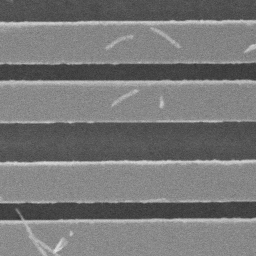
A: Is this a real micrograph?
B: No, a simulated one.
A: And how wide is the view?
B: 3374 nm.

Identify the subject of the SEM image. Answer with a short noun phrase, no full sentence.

lines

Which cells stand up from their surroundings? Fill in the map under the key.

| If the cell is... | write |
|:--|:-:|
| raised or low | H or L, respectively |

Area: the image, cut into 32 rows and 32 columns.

LLLLLLLLLLLLLLLLLLLLLLLLLLLLLLLL
LLLLLLLLLLLLLLLLLLLLLLLLLLLLLLLL
LLLLLLLLLLLLLLLLLLLLLLLLLLLLLLLL
HHHHHHHHHHHHHHHHHHHHHHHHHHHHHHHH
HHHHHHHHHHHHHHHHHHHHHHHHHHHHHHHH
HHHHHHHHHHHHHHHHHHHHHHHHHHHHHHHH
HHHHHHHHHHHHHHHHHHHHHHHHHHHHHHHH
HHHHHHHHHHHHHHHHHHHHHHHHHHHHHHHH
LLLLLLLLLLLLLLLLLLLLLLLLLLLLLLLL
LLLLLLLLLLLLLLLLLLLLLLLLLLLLLLLL
HHHHHHHHHHHHHHHHHHHHHHHHHHHHHHHH
HHHHHHHHHHHHHHHHHHHHHHHHHHHHHHHH
HHHHHHHHHHHHHHHHHHHHHHHHHHHHHHHH
HHHHHHHHHHHHHHHHHHHHHHHHHHHHHHHH
HHHHHHHHHHHHHHHHHHHHHHHHHHHHHHHH
LLLLLLLLLLLLLLLLLLLLLLLLLLLLLLLL
LLLLLLLLLLLLLLLLLLLLLLLLLLLLLLLL
LLLLLLLLLLLLLLLLLLLLLLLLLLLLLLLL
LLLLLLLLLLLLLLLLLLLLLLLLLLLLLLLL
LLLLLLLLLLLLLLLLLLLLLLLLLLLLLLLL
HHHHHHHHHHHHHHHHHHHHHHHHHHHHHHHH
HHHHHHHHHHHHHHHHHHHHHHHHHHHHHHHH
HHHHHHHHHHHHHHHHHHHHHHHHHHHHHHHH
HHHHHHHHHHHHHHHHHHHHHHHHHHHHHHHH
HHHHHHHHHHHHHHHHHHHHHHHHHHHHHHHH
LLLLLLLLLLLLLLLLLLLLLLLLLLLLLLLL
LLLLLLLLLLLLLLLLLLLLLLLLLLLLLLLL
LLHLLLLLLHHHHHHHHHHHHHHHHHHHHHHH
HHHHHHHHHHHHHHHHHHHHHHHHHHHHHHHH
HHHHHHHHHHHHHHHHHHHHHHHHHHHHHHHH
HHHHHHHHHHHHHHHHHHHHHHHHHHHHHHHH
HHHHHHHHHHHHHHHHHHHHHHHHHHHHHHHH